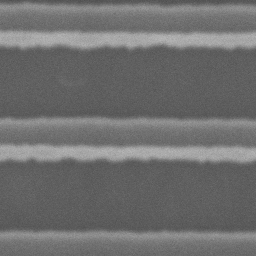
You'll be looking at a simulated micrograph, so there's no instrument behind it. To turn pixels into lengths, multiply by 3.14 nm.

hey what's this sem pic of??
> lines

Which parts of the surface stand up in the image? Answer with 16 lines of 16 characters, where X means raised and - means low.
XXXXXXXXXXXXXXXX
XXXXXXXXXXXXXXXX
XXXXXXXXXXXXXXXX
----------------
----------------
----------------
----------------
X-XXXXX-XXX--X--
XXXXXXXXXXXXXXXX
XXXXXXXXXXXXXXXX
----------------
----------------
----------------
----------------
-X----X---------
XXXXXXXXXXXXXXXX